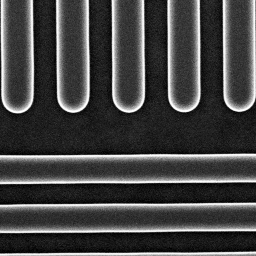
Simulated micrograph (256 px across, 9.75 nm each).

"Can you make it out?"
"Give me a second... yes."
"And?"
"groups of lines, slits or small figures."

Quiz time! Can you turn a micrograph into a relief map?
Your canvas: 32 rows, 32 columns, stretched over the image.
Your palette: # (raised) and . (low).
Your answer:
####...####...####...####...####
####...####...####...####...####
####...####...####...####...####
####...####...####...####...####
####...####...####...####...####
####...####...####...####...####
####...####...####...####...####
####...####...####...####...####
####...####...####...####...####
####...####...####...####...####
####...####...####...####...####
####...####...####...####...####
####...####...####...####...####
.##.....##.....##.....##.....##.
................................
................................
................................
................................
................................
...........#####################
################################
################################
################################
................................
................................
................................
################################
################################
################################
................................
................................
................................